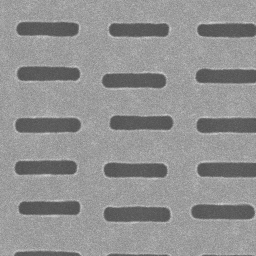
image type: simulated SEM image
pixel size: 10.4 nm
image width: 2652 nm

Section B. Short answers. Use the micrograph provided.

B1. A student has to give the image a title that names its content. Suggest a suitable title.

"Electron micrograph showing a regular array of holes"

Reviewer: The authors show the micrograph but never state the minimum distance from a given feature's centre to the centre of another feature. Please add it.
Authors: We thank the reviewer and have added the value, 450 nanometers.